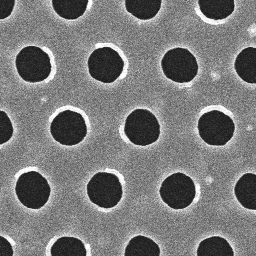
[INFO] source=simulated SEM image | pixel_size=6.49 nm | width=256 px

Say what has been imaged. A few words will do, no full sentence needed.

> a regular array of holes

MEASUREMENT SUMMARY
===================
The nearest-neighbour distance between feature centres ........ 468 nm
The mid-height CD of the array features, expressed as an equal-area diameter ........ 233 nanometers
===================